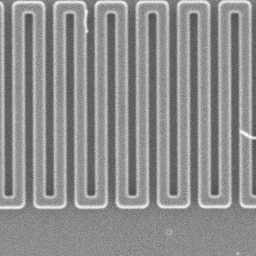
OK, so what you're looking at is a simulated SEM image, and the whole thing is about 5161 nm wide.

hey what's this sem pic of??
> groups of lines, slits or small figures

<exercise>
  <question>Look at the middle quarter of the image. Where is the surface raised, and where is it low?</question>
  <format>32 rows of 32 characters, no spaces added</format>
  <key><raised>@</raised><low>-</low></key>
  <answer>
---@@---@@@--@@@--@@@--@@@--@@@-
---@@---@@@--@@@--@@@--@@@--@@@-
---@@---@@@--@@@--@@@--@@@--@@@-
---@@@--@@@--@@@--@@@--@@@--@@@-
---@@@--@@@--@@@--@@@--@@@--@@@-
---@@@--@@@--@@@--@@@--@@@--@@@-
---@@@--@@@--@@@--@@@--@@@--@@@-
---@@@--@@@--@@@--@@@--@@@--@@@-
---@@@--@@@--@@@--@@@--@@@--@@@-
---@@@--@@@--@@@--@@@--@@@--@@@-
---@@@--@@@--@@@--@@@--@@@--@@@-
---@@@--@@@--@@@--@@@--@@@--@@@-
---@@@--@@@--@@@--@@@--@@@--@@@-
---@@@--@@@--@@@--@@@--@@@--@@@-
---@@@--@@@--@@@--@@@--@@@---@@-
---@@@--@@@--@@@--@@@--@@@---@@-
---@@@--@@@--@@@--@@@--@@@---@@-
---@@@--@@@--@@@--@@@--@@@---@@-
---@@@--@@@--@@@--@@@--@@@---@@-
---@@@--@@@--@@@--@@@---@@---@@-
---@@@--@@@--@@@--@@@---@@---@@-
---@@@--@@@--@@@--@@@---@@---@@-
---@@@--@@@--@@@--@@@---@@---@@-
---@@@--@@@--@@@--@@@---@@---@@-
---@@@--@@@--@@@--@@@---@@---@@-
---@@@--@@@--@@@--@@@---@@---@@-
---@@@--@@@--@@@--@@@---@@---@@-
---@@@--@@@--@@@--@@@---@@---@@-
---@@@--@@@--@@@--@@@---@@---@@-
---@@@--@@@--@@@--@@@---@@---@@-
---@@@--@@@--@@@--@@@---@@---@@-
---@@@--@@@--@@@--@@@---@@---@@-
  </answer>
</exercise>